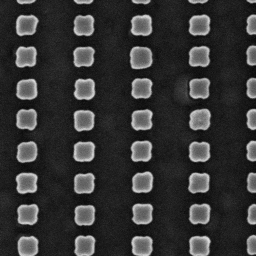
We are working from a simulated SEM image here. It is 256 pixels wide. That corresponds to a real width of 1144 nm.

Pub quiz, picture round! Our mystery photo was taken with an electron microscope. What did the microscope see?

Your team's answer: a regular array of raised bodies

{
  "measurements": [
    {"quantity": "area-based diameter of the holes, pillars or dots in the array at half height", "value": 93.4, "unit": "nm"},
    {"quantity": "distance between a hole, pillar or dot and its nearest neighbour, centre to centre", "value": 140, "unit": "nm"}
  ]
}